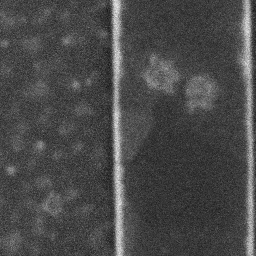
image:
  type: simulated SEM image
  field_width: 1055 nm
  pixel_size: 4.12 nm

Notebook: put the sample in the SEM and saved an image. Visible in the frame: one or a few lines or trenches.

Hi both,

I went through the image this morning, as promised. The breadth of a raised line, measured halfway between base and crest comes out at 553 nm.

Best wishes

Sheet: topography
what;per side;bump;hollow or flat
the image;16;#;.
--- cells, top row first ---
.......#########
.......#########
.......#########
.......#########
.......#########
.......#########
.......#########
.......#########
.......#########
.......#########
.......#########
.......#########
.......#########
.......#########
.......#########
.......#########